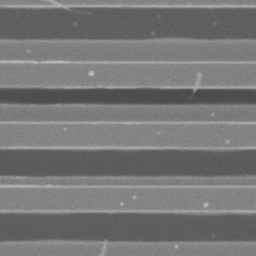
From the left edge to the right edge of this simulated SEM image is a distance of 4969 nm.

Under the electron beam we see lines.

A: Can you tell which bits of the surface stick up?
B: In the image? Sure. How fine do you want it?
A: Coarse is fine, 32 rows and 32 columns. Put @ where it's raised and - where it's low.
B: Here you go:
@@@@@@@@@@@@@@@@@@@@@@@@@@@@@@@@
--------------------------------
--------------------------------
--------------------------------
--------------------------------
@@@@@@@@@@@@@@@@@@@@@@@@@@@@@@@@
@@@@@@@@@@@@@@@@@@@@@@@@@@@@@@@@
@@@@@@@@@@@@@@@@@@@@@@@@@@@@@@@@
@@@@@@@@@@@@@@@@@@@@@@@@@@@@@@@@
@@@@@@@@@@@@@@@@@@@@@@@@@@@@@@@@
@@@@@@@@@@@@@@@@@@@@@@@@@@@@@@@@
--------------------------------
--------------------------------
@@@@@@@@@@@@@@@@@@@@@@@@@@@@@@@@
@@@@@@@@@@@@@@@@@@@@@@@@@@@@@@@@
@@@@@@@@@@@@@@@@@@@@@@@@@@@@@@@@
@@@@@@@@@@@@@@@@@@@@@@@@@@@@@@@@
@@@@@@@@@@@@@@@@@@@@@@@@@@@@@@@@
@@@@@@@@@@@@@@@@@@@@@@@@@@@@@@@@
--------------------------------
--------------------------------
--------------------------------
@@@@@@@@@@@@@@@@@@@@@@@@@@@@@@@@
@@@@@@@@@@@@@@@@@@@@@@@@@@@@@@@@
@@@@@@@@@@@@@@@@@@@@@@@@@@@@@@@@
@@@@@@@@@@@@@@@@@@@@@@@@@@@@@@@@
-----------------------------@@@
--------------------------------
--------------------------------
--------------------------------
@@@@@@@@@@@@@@@@@@@@@@@@@@@@@@@@
@@@@@@@@@@@@@@@@@@@@@@@@@@@@@@@@